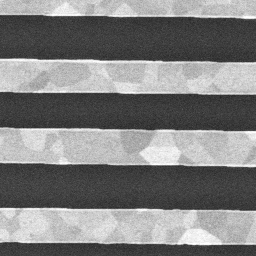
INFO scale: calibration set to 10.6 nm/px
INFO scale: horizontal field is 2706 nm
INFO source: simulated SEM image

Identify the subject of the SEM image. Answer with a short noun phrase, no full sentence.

lines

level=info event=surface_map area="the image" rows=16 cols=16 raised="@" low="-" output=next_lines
@@@@@@@@@@@@@@@@
----------------
----------------
----------------
@@@@@@@@@@@@@@@@
@@@@@@@@@@@@@@@@
----------------
----------------
@@@@@@@@@@@@@@@@
@@@@@@@@@@@@@@@@
----------------
----------------
----------------
@@@@@@@@@@@@@@@@
@@@@@@@@@@@@@@@@
----------------